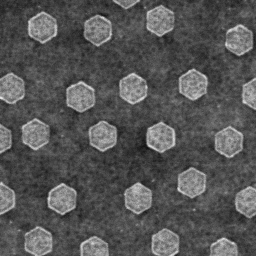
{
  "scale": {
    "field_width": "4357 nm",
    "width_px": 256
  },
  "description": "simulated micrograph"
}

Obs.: a regular array of raised bodies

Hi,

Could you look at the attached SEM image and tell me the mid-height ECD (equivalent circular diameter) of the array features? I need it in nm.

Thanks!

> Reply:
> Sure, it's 474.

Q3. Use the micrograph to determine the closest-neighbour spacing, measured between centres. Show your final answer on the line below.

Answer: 0.946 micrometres